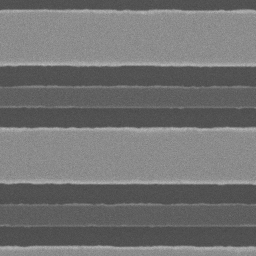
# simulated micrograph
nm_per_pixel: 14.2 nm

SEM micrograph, lines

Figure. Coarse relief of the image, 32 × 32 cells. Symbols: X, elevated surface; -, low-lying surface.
--------------------------------
XXXXXXXXXXXXXXXXXXXXXXXXXXXXXXXX
XXXXXXXXXXXXXXXXXXXXXXXXXXXXXXXX
XXXXXXXXXXXXXXXXXXXXXXXXXXXXXXXX
XXXXXXXXXXXXXXXXXXXXXXXXXXXXXXXX
XXXXXXXXXXXXXXXXXXXXXXXXXXXXXXXX
XXXXXXXXXXXXXXXXXXXXXXXXXXXXXXXX
XXXXXXXXXXXXXXXXXXXXXXXXXXXXXXXX
--------------------------------
--------------------------------
--------------------------------
XXXXXXXXXXXXXXXXXXXXXXXXXXXXXXXX
XXXXXXXXXXXXXXXXXXXXXXXXXXXXXXXX
----------------------X------XXX
--------------------------------
--------------------------------
XXXXXXXXXXXXXXXXXXXXXXXXXXXXXXXX
XXXXXXXXXXXXXXXXXXXXXXXXXXXXXXXX
XXXXXXXXXXXXXXXXXXXXXXXXXXXXXXXX
XXXXXXXXXXXXXXXXXXXXXXXXXXXXXXXX
XXXXXXXXXXXXXXXXXXXXXXXXXXXXXXXX
XXXXXXXXXXXXXXXXXXXXXXXXXXXXXXXX
XXXXXXXXXXXXXXXXXXXXXXXXXXXXXXXX
--------------------------------
--------------------------------
--------------------------------
XXXXXXXXXXXXXXXXXXXXXXXXXXXXXXXX
XXXXXXXXXXXXXXXXXXXXXXXXXXXXXXXX
--------------------------------
--------------------------------
--------------------------------
XXXXXXXXXXXXXXXXXXXXXXXXXXXXXXXX